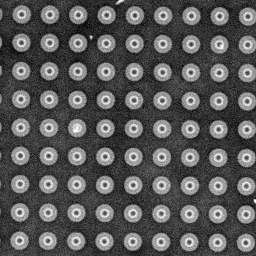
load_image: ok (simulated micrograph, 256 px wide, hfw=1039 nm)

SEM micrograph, an array of small figures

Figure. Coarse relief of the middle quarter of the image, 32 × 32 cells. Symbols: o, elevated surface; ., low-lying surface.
..ooo....ooo....ooo....ooo....oo
.ooooo..ooooo..ooooo...oooo...oo
.ooooo..ooooo..ooooo...oooo...oo
..ooo....ooo....ooo....ooo....oo
................................
................................
................................
..ooo....ooo....ooo....ooo....oo
.oooo...ooooo..ooooo..ooooo...oo
.oooo...ooooo..ooooo..ooooo...oo
..ooo....ooo....ooo....ooo....oo
................................
................................
................................
..ooo....ooo....ooo....ooo....oo
.oooo...ooooo..ooooo..ooooo..ooo
.oooo...ooooo..ooooo..ooooo..ooo
..ooo....ooo....ooo....ooo....oo
................................
................................
................................
..ooo....ooo....ooo....ooo....oo
.oooo...oooo...oooo...ooooo..ooo
.oooo...oooo...ooooo..ooooo..ooo
..ooo....ooo....ooo....ooo....oo
...............................o
................................
................................
..ooo....ooo....ooo....ooo....oo
.oooo...oooo...oooo...oooo...ooo
.oooo...oooo...oooo...ooooo..ooo
.oooo...oooo...oooo...oooo....oo